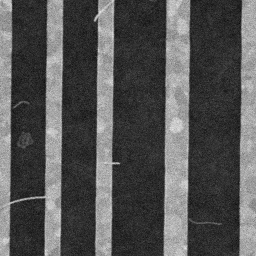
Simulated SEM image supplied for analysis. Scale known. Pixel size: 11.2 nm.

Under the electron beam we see groups of lines, slits or small figures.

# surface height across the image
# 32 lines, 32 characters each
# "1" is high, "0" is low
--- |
10000011000011000000011100000011
10000011000011000000011100000011
10000011000011000000011100000011
10000011000011000000011100000011
10000011000011000000011100000011
10000011000011000000011100000011
10000011000011000000011100000011
10000011000011000000011100000011
10000011000011000000011100000011
10000011000011000000011100000011
10000011000011000000011100000011
10000011000011000000011100000011
10000011000011000000011100000011
10000011000011000000011000000011
10000011000011000000011000000011
10000011000011000000011000000011
10000011000011000000011000000011
10110011000011000000011000000011
10000011000011000000011000000011
10000011000011000000011000000011
10000011000011000000011000000011
10000011000011000000011000000011
10000011000011000000011000000011
10000011000011000000011000000011
10000010000011000000011000000011
10000010000011000000011000000011
10000010000011000000011000000011
10000010000011000000011000000011
10000010000011000000011000000011
10000010000011000000011000000011
10000010000011000000011000000011
10000010000011000000011000000011